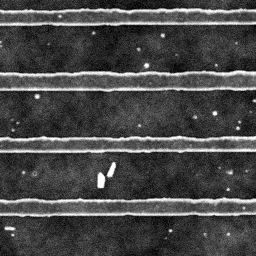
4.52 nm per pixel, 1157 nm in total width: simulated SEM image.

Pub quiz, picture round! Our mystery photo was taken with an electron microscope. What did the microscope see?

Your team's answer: lines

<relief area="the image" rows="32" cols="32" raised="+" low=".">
................................
++++++++++++++++++++++++++++++++
++++++++++++++++++++++++++++++++
................................
................................
................................
................................
................................
................................
++++++++++++++++++++++++++++++++
++++++++++++++++++++++++++++++++
................................
................................
................................
................................
................................
................................
++++++++++++++++++++++++++++++++
++++++++++++++++++++++++++++++++
................................
................................
................................
................................
................................
................................
++++++++++++++++++++++++++++++++
++++++++++++++++++++++++++++++++
................................
................................
................................
................................
................................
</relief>